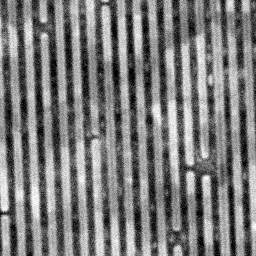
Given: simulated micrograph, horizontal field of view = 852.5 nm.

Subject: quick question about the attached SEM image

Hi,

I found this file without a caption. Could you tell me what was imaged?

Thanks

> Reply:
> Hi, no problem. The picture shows parallel lines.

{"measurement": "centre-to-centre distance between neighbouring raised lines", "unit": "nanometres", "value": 52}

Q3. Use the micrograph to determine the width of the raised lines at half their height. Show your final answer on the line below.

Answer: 19.1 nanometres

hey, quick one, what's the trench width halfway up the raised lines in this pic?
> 32 nm